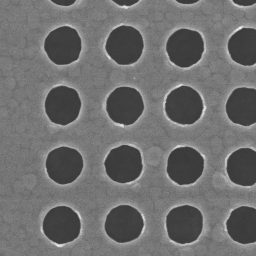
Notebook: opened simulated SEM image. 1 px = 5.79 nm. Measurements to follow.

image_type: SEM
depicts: a regular array of holes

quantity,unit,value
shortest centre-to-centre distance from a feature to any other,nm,342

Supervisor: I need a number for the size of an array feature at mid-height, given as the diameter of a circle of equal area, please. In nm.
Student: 220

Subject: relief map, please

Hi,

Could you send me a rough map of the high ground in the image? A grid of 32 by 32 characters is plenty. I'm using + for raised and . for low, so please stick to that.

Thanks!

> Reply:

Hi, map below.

+++++++..++++++..+++++++++++++..
++++++++++++++++++++++++++++++++
++++++++++++++++++++++++++++++++
+++++++..++++++..+++++++++++++++
++++++....++++....+++....++++...
++++++....+++.....+++....++++...
++++++....+++.....+++....++++...
++++++...+++++...++++....++++...
++++++++++++++++++++++++++++++++
++++++++++++++++++++++++++++++++
++++++++++++++++++++++++++++++++
++++++....++++...++++....++++...
++++++....+++.....+++....+++....
++++++....+++.....+++....+++....
++++++....++++...++++....+++....
+++++++.+++++++.+++++++.++++++..
++++++++++++++++++++++++++++++++
++++++++++++++++++++++++++++++++
+++++++..++++++..+++++..++++++.+
++++++....+++.....+++....++++...
++++++....+++.....+++.....++....
++++++....+++.....+++....+++....
+++++++..+++++...++++....++++...
++++++++++++++++++++++++++++++++
++++++++++++++++++++++++++++++++
++++++++++++++++++++++++++++++++
++++++...+++++...++++....++++...
+++++.....+++.....+++....+++....
+++++.....+++.....+++....+++....
++++++....++++...++++....++++...
++++++++++++++++++++++++++++++++
++++++++++++++++++++++++++++++++